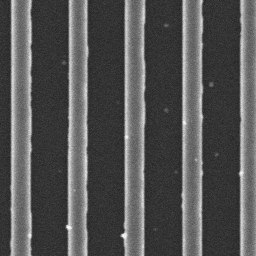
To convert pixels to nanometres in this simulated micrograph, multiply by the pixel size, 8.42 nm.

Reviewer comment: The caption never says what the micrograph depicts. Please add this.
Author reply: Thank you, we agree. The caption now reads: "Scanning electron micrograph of lines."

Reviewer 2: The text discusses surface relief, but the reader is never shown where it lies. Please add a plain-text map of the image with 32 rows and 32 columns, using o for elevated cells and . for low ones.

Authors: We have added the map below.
.ooo.....oo.....oo.....oo.....oo
.ooo.....oo.....oo.....oo.....oo
.ooo.....oo.....oo.....oo.....oo
.ooo.....oo.....oo.....oo.....oo
.ooo.....oo.....oo.....oo.....oo
.ooo.....oo.....oo.....oo.....oo
.ooo.....oo.....oo.....oo.....oo
.ooo.....oo.....oo.....oo.....oo
.ooo.....oo.....oo.....oo.....oo
.ooo.....oo.....oo.....oo.....oo
.ooo.....oo.....oo.....oo.....oo
.ooo.....oo.....oo.....oo.....oo
.ooo.....oo.....oo.....oo.....oo
.ooo.....oo.....oo.....oo.....oo
.ooo.....oo.....oo.....oo.....oo
.ooo.....oo.....oo.....oo.....oo
.ooo.....oo.....oo.....oo.....oo
.ooo.....oo.....oo.....oo.....oo
.ooo.....oo.....oo.....oo.....oo
.ooo.....oo.....oo.....oo.....oo
.ooo.....oo.....oo.....oo.....oo
.ooo.....oo.....oo.....oo.....oo
.ooo.....oo.....oo.....oo.....oo
.ooo.....oo.....oo.....oo.....oo
.ooo.....oo.....oo.....oo.....oo
.ooo.....oo.....oo.....oo.....oo
.ooo.....oo.....oo.....oo.....oo
.ooo.....oo.....oo.....oo.....oo
.ooo....ooo.....oo.....oo.....oo
.ooo.....oo....ooo.....oo.....oo
.ooo.....oo.....oo.....oo.....oo
.ooo.....oo.....oo.....oo.....oo